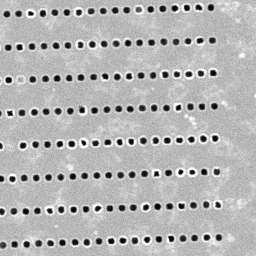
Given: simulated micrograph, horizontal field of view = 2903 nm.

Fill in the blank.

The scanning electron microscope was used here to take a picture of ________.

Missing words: a regular array of holes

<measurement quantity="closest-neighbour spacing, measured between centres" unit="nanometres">133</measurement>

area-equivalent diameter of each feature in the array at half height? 83.4 nm